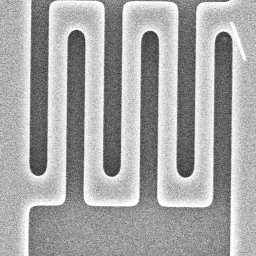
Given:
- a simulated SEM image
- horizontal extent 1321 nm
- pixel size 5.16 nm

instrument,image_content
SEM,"groups of lines, slits or small figures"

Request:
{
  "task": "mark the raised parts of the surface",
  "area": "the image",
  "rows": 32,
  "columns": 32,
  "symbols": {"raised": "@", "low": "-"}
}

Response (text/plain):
@@@@---@@@@@@---@@@@@@---@@@@@@@
@@@@--@@@@@@@--@@@@@@@---@@@@@@@
@@@@--@@@@@@@--@@@@@@@---@@@@@@@
@@@@--@@@@@@@--@@@@@@@---@@@@@@@
@@@@--@@@--@@--@@@--@@---@@--@@@
@@@@--@@---@@--@@@--@@---@@--@@@
@@@@--@@---@@--@@@--@@---@@--@@@
@@@@--@@---@@--@@@--@@---@@--@@@
@@@@--@@---@@--@@@--@@--@@@--@@@
@@@@--@@---@@--@@@--@@--@@@--@@@
@@@@--@@---@@--@@@--@@--@@@--@@@
@@@@--@@---@@--@@@--@@--@@@--@@@
@@@@--@@---@@--@@---@@--@@@--@@@
@@@@--@@---@@--@@---@@--@@@--@@@
@@@@--@@---@@--@@---@@--@@@--@@@
@@@@--@@---@@--@@---@@--@@@--@@@
@@@@--@@---@@--@@---@@--@@@--@@@
@@@@--@@---@@--@@---@@--@@@--@@@
@@@@--@@---@@--@@---@@--@@@--@@@
@@@@--@@---@@--@@---@@--@@@--@@@
@@@@--@@---@@--@@---@@--@@@--@@@
@@@@--@@---@@--@@---@@--@@@--@@@
@@@@@@@@---@@@@@@---@@@@@@@--@@@
@@@@@@@@---@@@@@@---@@@@@@@--@@@
@@@@@@@@---@@@@@@---@@@@@@@--@@@
@@@@@@@----@@@@@@---@@@@@@---@@@
@@@@-------------------------@@@
@@@@-------------------------@@@
@@@@-------------------------@@@
@@@@-------------------------@@@
@@@--------------------------@@@
@@@@-------------------------@@@